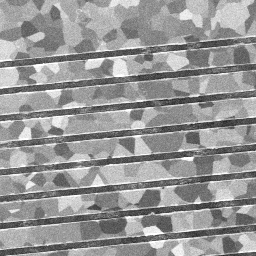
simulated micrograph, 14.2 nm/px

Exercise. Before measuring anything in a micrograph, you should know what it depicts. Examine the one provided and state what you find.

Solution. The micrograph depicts parallel lines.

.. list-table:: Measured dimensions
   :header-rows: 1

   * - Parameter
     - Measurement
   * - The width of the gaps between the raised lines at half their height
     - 105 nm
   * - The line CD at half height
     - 277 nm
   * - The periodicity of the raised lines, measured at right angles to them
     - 26.8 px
